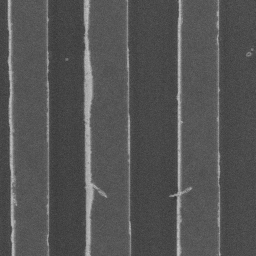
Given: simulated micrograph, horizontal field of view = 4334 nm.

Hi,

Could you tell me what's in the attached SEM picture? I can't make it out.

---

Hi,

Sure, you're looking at lines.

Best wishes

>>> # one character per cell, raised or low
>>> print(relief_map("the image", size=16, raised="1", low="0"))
0110011100011100
0110011100011100
0110011100011100
0110011100011100
0110011100011100
0110001100011100
0110011100011100
0110011100011100
0110011100011100
0110011100011100
0110001100011100
0110001100011100
0110001100011100
0110011100011100
0110001100011100
0110011100011100